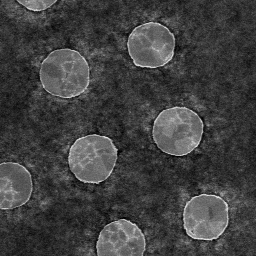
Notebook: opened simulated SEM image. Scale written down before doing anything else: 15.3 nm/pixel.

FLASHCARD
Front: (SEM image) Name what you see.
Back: raised bodies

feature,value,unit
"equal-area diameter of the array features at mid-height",738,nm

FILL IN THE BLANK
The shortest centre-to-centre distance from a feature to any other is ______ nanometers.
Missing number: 1370